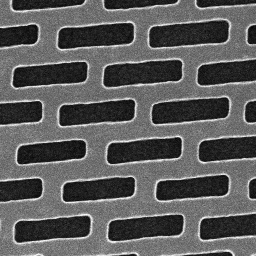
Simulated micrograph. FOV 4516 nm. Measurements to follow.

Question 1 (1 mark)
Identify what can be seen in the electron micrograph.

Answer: a regular array of holes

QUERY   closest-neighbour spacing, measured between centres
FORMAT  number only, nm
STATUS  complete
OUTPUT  1060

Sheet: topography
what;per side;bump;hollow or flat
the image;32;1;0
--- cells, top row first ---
10000000001110000000011110000001
11111111111111111111111111111111
11111111111111111111111111101111
00000111000000000110000000000110
00000110000000000110000000000110
00001110000000001110000000111110
11111111111111111111111111111111
11111111111111111111001111111110
11000000000110000000000110000000
11000000000110000000000110000000
11000000011110000111111110001111
11111111111111111111111111111111
11111111111111101111111100001111
00000111000000000110000000000110
00000110000000000110000000001110
00111111000111111110011111111111
11111111111111111111111111111111
11111111101111111100000111000000
11000000000110000000000110000000
11000000000110000000001110000000
11111111111111011111111111111111
11111111111111111111111111111111
11100111111000000111100000000111
00000111000000000111000000000110
00000111000000001111000000011110
11111111111111111111111111111111
11111111111111111111111111111111
11111000000111100000000110000000
11000000000111000000000110000000
11000000000111000000011110000000
11111111111111111111111111111111
11111111111111111111111111100111